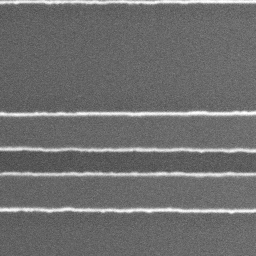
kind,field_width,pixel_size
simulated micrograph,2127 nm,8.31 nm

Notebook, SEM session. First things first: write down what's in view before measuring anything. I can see lines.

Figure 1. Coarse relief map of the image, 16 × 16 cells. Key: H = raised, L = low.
LLLLLLLLLLLLLLLL
LLLLLLLLLLLLLLLL
LLLLLLLLLLLLLLLL
LLLLLLLLLLLLLLLL
LLLLLLLLLLLLLLLL
LLLLLLLLLLLLLLLL
LLLLLLLLLLLLLLLL
HHHHHHHHHHHHHHHH
HHHHHHHHHHHHHHHH
LLLLLLLLLLLLLLLL
LLLLLLLLLLLLLLLL
HHHHHHHHHHHHHHHH
HHHHHHHHHHHHHHHH
LLLLLLLLLLLLLLLL
LLLLLLLLLLLLLLLL
LLLLLLLLLLLLLLLL